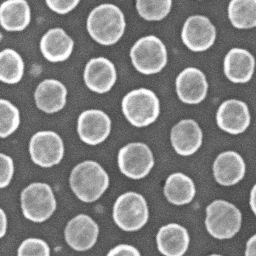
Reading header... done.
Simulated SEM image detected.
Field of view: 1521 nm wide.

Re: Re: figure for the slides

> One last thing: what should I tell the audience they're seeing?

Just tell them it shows a regular array of raised bodies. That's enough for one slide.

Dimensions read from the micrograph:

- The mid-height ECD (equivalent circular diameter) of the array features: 196 nanometers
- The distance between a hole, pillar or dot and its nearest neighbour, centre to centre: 0.305 µm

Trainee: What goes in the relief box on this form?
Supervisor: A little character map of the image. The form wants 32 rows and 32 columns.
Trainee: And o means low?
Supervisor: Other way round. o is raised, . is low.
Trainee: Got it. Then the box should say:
ooo...ooo........oooo........ooo
oooo...o....ooo..oooo........ooo
oooo.......oooo.........oo...ooo
.oo........oooo........oooo.....
......oo....ooo........oooo.....
.....oooo....o...ooo...ooo......
oo...oooo.......ooooo........oo.
ooo...o.....o....oooo.......oooo
ooo........ooo...ooo........oooo
ooo........ooo........ooo...ooo.
.....ooo...ooo........oooo......
....oooo.........oo...oooo......
....oooo........oooo...oo.......
oo...ooo.......ooooo........ooo.
oo........ooo...oooo.......oooo.
oo........oooo...o....ooo..oooo.
o.........oooo.......oooo....o..
....oooo..ooo........oooo.......
....oooo........oo....ooo.......
o...oooo.......oooo........ooo..
o....oo...oo...oooo........ooo..
o........oooo..ooo.........ooo..
o........oooo........ooo...ooo..
...ooo...oooo........ooo........
...oooo...oo...oo....ooo.......o
...oooo.......oooo.........oo..o
...oooo.......oooo........oooo..
o...o....oo...oooo........oooo..
o.......oooo...oo...ooo...oooo..
........oooo........ooo....oo...
...ooo...ooo........ooo........o
..oooo........ooo...ooo........o